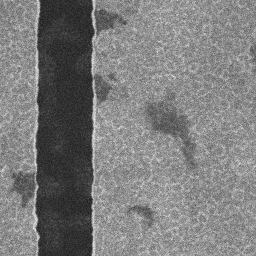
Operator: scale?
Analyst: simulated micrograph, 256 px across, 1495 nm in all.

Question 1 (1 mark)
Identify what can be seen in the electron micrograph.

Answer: one or a few lines or trenches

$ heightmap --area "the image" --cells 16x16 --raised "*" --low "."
**....**********
**....**********
**....**********
**....**********
**....**********
**....**********
**....**********
**....**********
**....**********
**....**********
**....**********
**....**********
**....**********
**....**********
**....**********
**....**********